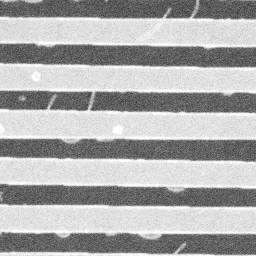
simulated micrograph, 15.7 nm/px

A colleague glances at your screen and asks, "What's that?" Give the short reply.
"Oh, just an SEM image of lines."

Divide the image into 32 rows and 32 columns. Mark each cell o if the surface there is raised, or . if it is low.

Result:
................................
................................
ooooooooooooooooooooooooooooo.o.
oooooooooooooooooooooooooooooooo
oooooooooooooooooooooooooooooooo
...........ooooooooooooooooooooo
................................
................................
ooooooooooooooooooooooooo.......
oooooooooooooooooooooooooooooooo
oooooooooooooooooooooooooooooooo
...........o...................o
................................
................................
oooooooooooooooooooooooooooooooo
oooooooooooooooooooooooooooooooo
oooooooooooooooooooooooooooooooo
................................
................................
................................
oooooooooooooooooooooooooooooooo
oooooooooooooooooooooooooooooooo
oooooooooooooooooooooooooooooooo
................................
................................
................................
oooooooooooooooooooooooooooooooo
oooooooooooooooooooooooooooooooo
oooooooooooooooooooooooooooooooo
................................
................................
................................